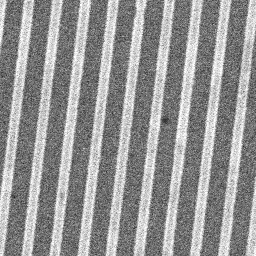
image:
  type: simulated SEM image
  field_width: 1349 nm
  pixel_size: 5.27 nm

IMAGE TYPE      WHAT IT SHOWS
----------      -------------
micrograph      parallel lines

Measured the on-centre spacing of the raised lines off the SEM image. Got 0.147 micrometres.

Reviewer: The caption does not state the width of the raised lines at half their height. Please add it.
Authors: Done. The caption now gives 41.2 nm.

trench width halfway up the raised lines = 108 nm